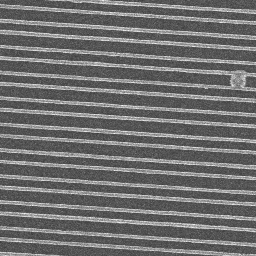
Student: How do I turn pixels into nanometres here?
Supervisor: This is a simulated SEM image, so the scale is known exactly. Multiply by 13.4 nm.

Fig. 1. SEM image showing parallel lines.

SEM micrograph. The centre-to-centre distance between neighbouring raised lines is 173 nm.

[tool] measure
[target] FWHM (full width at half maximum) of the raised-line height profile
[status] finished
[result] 0.0352 µm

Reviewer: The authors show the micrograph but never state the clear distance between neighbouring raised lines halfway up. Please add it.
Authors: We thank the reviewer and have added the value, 0.117 µm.